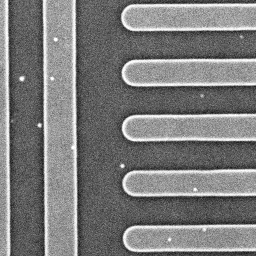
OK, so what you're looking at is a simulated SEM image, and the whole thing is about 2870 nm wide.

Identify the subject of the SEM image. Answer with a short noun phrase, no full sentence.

groups of lines, slits or small figures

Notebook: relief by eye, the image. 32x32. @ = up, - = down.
@-----@@@-----------------------
@-----@@@------@@@@@@@@@@@@@@@@@
@-----@@@------@@@@@@@@@@@@@@@@@
@-----@@@-------@@@@@@@@@@@@@@@@
@-----@@@-----------------------
@-----@@@-----------------------
@-----@@@-----------------------
@-----@@@--------------@@@@@@@@@
@-----@@@------@@@@@@@@@@@@@@@@@
@-----@@@------@@@@@@@@@@@@@@@@@
@-----@@@-------@@@@@@@@@@@@@@@@
@-----@@@-----------------------
@-----@@@-----------------------
@-----@@@-----------------------
@-----@@@--------@@@@@@@@@@@@@@@
@----@@@@------@@@@@@@@@@@@@@@@@
@-----@@@------@@@@@@@@@@@@@@@@@
@-----@@@--------@--------------
@-----@@@-----------------------
@-----@@@-----------------------
@-----@@@-----------------------
@-----@@@--------@@@@@@@@@@@@@@@
@-----@@@------@@@@@@@@@@@@@@@@@
@-----@@@-------@@@@@@@@@@@@@@@@
@-----@@@@----------------------
@-----@@@@----------------------
@-----@@@@----------------------
@-----@@@@----------------------
@-----@@@@------@@@@@@@@@@@@@@@@
@-----@@@@-----@@@@@@@@@@@@@@@@@
@-----@@@@------@@@@@@@@@@@@@@@@
@-----@@@@----------------------